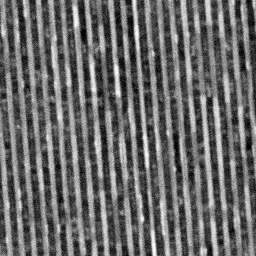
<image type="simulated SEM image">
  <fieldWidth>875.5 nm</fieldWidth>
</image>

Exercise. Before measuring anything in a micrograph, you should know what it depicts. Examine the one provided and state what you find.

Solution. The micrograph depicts parallel lines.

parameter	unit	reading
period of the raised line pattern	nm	41.1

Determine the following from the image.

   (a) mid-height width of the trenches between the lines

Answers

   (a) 8.1 pixels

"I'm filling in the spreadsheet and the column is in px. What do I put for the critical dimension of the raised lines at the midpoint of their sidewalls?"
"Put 3.98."